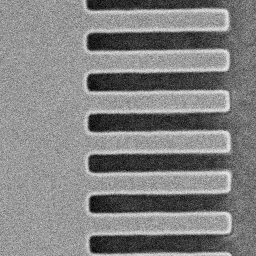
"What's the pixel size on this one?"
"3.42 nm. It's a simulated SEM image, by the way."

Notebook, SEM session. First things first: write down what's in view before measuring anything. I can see groups of lines, slits or small figures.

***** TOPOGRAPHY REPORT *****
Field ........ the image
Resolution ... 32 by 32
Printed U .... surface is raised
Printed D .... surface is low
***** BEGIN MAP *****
UUUUUUUUUUUDDDDDDDDDDDDDDDDDDDDD
UUUUUUUUUUUUUUUUUUUUUUUUUUUUDDDD
UUUUUUUUUUUUUUUUUUUUUUUUUUUUDDDD
UUUUUUUUUUUUUUUUUUUUUUUUUUUUDDDD
UUUUUUUUUUUDDDDDDDDDDDDDDDDDDDDD
UUUUUUUUUUUDDDDDDDDDDDDDDDDDDDDD
UUUUUUUUUUUUUUUUUUUUUUUUUUUUDDDD
UUUUUUUUUUUUUUUUUUUUUUUUUUUUUDDD
UUUUUUUUUUUUUUUUUUUUUUUUUUUUDDDD
UUUUUUUUUUUDDDDDDDDDDDDDDDDDDDDD
UUUUUUUUUUUDDDDDDDDDDDDDDDDDDDDD
UUUUUUUUUUUUDDDDDDDUUUUUUUUUDDDD
UUUUUUUUUUUUUUUUUUUUUUUUUUUUUDDD
UUUUUUUUUUUUUUUUUUUUUUUUUUUUUDDD
UUUUUUUUUUUDDDDDDDDDDDDDDDDDDDDD
UUUUUUUUUUUDDDDDDDDDDDDDDDDDDDDD
UUUUUUUUUUUUDDDDDDDUUUUUUUUUDDDD
UUUUUUUUUUUUUUUUUUUUUUUUUUUUUDDD
UUUUUUUUUUUUUUUUUUUUUUUUUUUUUDDD
UUUUUUUUUUUDDDDDDDDDDDDDDDDDDDDD
UUUUUUUUUUUDDDDDDDDDDDDDDDDDDDDD
UUUUUUUUUUUDDDDDDDDDDDDDDDDDDDDD
UUUUUUUUUUUUUUUUUUUUUUUUUUUUUDDD
UUUUUUUUUUUUUUUUUUUUUUUUUUUUUDDD
UUUUUUUUUUUUDDDDDDDDDDDDDDDDDDDD
UUUUUUUUUUUDDDDDDDDDDDDDDDDDDDDD
UUUUUUUUUUUDDDDDDDDDDDDDDDDDDDDD
UUUUUUUUUUUUUUUUUUUUUUUUUUUUUDDD
UUUUUUUUUUUUUUUUUUUUUUUUUUUUUDDD
UUUUUUUUUUUUDDDDDDDDDDDDDDDDDDDD
UUUUUUUUUUUDDDDDDDDDDDDDDDDDDDDD
UUUUUUUUUUUUDDDDDDDDDDDDDDDDDDDD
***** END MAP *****